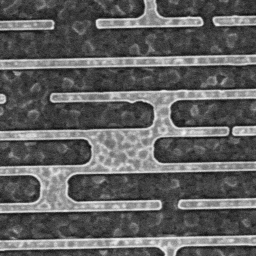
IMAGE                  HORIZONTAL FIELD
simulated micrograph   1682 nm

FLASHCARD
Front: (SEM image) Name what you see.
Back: parallel lines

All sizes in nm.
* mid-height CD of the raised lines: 56.7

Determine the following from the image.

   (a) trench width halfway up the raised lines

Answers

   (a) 184 nanometres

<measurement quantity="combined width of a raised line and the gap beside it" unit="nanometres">240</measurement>